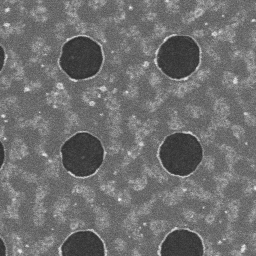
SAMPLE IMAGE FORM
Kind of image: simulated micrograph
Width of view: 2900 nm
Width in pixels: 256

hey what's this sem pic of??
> holes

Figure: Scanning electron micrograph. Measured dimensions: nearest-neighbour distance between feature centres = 1090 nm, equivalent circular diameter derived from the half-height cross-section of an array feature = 494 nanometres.